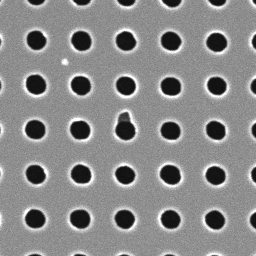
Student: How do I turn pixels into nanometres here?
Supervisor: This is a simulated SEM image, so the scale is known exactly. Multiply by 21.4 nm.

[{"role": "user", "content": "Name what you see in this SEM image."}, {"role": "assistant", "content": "a regular array of holes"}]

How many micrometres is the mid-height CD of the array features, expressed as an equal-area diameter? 0.435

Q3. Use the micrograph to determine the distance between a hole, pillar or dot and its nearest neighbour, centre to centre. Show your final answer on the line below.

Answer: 952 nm